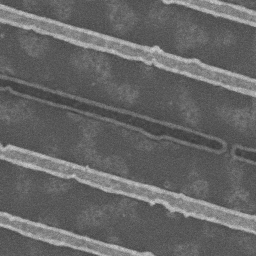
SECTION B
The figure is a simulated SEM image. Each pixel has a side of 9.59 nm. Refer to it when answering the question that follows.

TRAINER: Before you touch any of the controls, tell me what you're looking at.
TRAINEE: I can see one or a few lines or trenches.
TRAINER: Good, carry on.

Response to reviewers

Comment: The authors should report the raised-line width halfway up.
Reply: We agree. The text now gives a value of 126 nanometres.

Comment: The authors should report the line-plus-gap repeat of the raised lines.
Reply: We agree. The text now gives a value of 634 nm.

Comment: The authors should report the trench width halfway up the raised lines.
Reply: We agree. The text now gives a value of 512 nanometres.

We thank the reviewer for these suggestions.